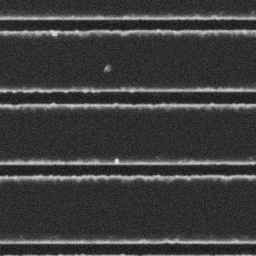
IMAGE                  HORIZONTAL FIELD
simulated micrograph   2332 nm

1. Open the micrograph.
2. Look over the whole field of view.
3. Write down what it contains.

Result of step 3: lines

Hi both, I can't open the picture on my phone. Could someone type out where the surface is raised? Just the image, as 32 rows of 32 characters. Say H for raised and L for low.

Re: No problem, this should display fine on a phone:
HHHHHHHHHHHHHHHHHHHHHHHHHHHHHHHH
HHHHHHHHHHHHHHHHHHHHHHHHHHHHHHHH
LLLLLLLLLLLLLLLLLLLLLLLLLLLLLLLL
LLLLLLLLLLLLLLLLLLLLLLLLLLLLLLLL
HHHHHHHHHHHHHHHHHHHHHHHHHHHHHHHH
HHHHHHHHHHHHHHHHHHHHHHHHHHHHHHHH
HHHHHHHHHHHHHHHHHHHHHHHHHHHHHHHH
HHHHHHHHHHHHHHHHHHHHHHHHHHHHHHHH
HHHHHHHHHHHHHHHHHHHHHHHHHHHHHHHH
HHHHHHHHHHHHHHHHHHHHHHHHHHHHHHHH
HHHHHHHHHHHHHHHHHHHHHHHHHHHHHHHH
LLLLLLLLLLLLLLLLLLLLLLLLLLLLLLLL
LLLLLLLLLLLLLLLLLLLLLLLLLLLLLLLL
HHHHHHHHHHHHHHHHHHHHHHHHHHHHHHHH
HHHHHHHHHHHHHHHHHHHHHHHHHHHHHHHH
HHHHHHHHHHHHHHHHHHHHHHHHHHHHHHHH
HHHHHHHHHHHHHHHHHHHHHHHHHHHHHHHH
HHHHHHHHHHHHHHHHHHHHHHHHHHHHHHHH
HHHHHHHHHHHHHHHHHHHHHHHHHHHHHHHH
HHHHHHHHHHHHHHHHHHHHHHHHHHHHHHHH
LLLLLLLLLLLLLLLLLLLLLLLLLLLLLLLL
LLLLLLLLLLLLLLLLLLLLLLLLLLLLLLLL
HHHHHHHHHHHHHHHHHHHHHHHHHHHHHHHH
HHHHHHHHHHHHHHHHHHHHHHHHHHHHHHHH
HHHHHHHHHHHHHHHHHHHHHHHHHHHHHHHH
HHHHHHHHHHHHHHHHHHHHHHHHHHHHHHHH
HHHHHHHHHHHHHHHHHHHHHHHHHHHHHHHH
HHHHHHHHHHHHHHHHHHHHHHHHHHHHHHHH
HHHHHHHHHHHHHHHHHHHHHHHHHHHHHHHH
HHHHHHHHHHHHHHHHHHHHHHHHHHHHHHHH
LLLLLLLLLLLLLLLLLLLLLLLLLLLLLLLL
LLLLLLLLLLLLLLLLLLLLLLLLLLLLLLLL